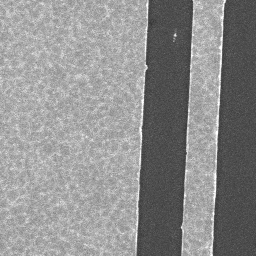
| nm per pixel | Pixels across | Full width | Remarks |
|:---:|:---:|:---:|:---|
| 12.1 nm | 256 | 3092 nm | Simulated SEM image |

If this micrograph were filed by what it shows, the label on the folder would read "one or a few lines or trenches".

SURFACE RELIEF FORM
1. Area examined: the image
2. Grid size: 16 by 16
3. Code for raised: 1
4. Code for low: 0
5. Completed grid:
1111111110001100
1111111110001100
1111111110001100
1111111110001100
1111111110001100
1111111110001100
1111111110001100
1111111110001100
1111111110001100
1111111110001100
1111111110001100
1111111110001000
1111111110001000
1111111110011000
1111111110011000
1111111110011000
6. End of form